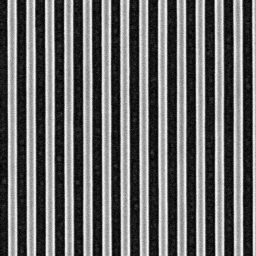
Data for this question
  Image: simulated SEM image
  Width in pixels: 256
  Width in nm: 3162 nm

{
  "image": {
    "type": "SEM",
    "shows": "parallel lines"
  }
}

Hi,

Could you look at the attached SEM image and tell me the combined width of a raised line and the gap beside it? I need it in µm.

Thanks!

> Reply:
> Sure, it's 0.233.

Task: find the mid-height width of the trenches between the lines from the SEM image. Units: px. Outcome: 10.6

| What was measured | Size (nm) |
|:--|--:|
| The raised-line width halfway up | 95.7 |